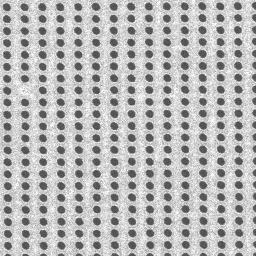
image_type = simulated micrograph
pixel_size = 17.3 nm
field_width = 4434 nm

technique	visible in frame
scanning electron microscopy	a regular array of holes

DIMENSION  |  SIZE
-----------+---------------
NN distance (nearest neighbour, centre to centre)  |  204 nm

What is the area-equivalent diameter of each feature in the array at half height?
0.141 microns